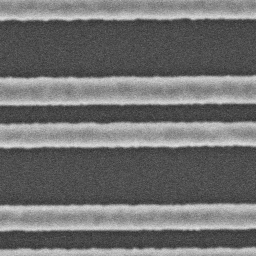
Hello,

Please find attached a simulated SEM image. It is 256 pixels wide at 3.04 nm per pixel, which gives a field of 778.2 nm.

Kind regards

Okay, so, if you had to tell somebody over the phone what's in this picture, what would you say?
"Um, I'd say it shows lines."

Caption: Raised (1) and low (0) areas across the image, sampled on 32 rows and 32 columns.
11111111111111111111111111111111
11111111111111111111111111111111
10110100100000000000000000000000
00000000000000000000000000000000
00000000000000000000000000000000
00000000000000000000000000000000
00000000000000000000000000000000
00000000000000000000000000000000
00000000000000000000000000000000
00000000000000000000000000000000
11111111111111111111111111111111
11111111111111111111111111111111
11111111111111111111111111111111
00000000000000000000000000000000
00000000000000000000000000000000
00000001001100111111111111111111
11111111111111111111111111111111
11111111111111111111111111111111
00000000000000000000000000000000
00000000000000000000000000000000
00000000000000000000000000000000
00000000000000000000000000000000
00000000000000000000000000000000
00000000000000000000000000000000
00000000000000000000000000000000
00000000000000000000000000000000
11111111111111111111111111111111
11111111111111111111111111111111
11111111111111111111111111111111
00000000000000000000000000000000
00000000000000000000000000000000
11111111111111111111111111111111